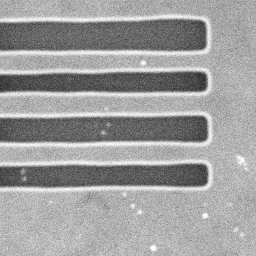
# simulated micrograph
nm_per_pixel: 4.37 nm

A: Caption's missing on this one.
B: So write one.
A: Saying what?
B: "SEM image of groups of lines, slits or small figures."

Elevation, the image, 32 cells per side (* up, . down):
********************************
********************************
*****************........*******
..........................******
..........................******
..........................******
******..***********.....********
********************************
********************************
..........................******
..........................******
.........................*******
********************************
********************************
********..................******
..........................******
..........................******
..........................******
********************************
********************************
*******.....**............******
..........................******
..........................******
..........**********************
********************************
********************************
********************************
********************************
********************************
********************************
********************************
********************************